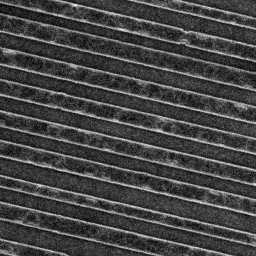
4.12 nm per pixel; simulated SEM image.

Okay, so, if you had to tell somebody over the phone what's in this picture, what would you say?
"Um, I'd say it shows parallel lines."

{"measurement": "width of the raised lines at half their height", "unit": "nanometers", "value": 64.8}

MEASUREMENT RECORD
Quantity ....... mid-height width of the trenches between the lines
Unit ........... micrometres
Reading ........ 0.0613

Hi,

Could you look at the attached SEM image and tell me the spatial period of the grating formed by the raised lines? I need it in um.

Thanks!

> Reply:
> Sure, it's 0.125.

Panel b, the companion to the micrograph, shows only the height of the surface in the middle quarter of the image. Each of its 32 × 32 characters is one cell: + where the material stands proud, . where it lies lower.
++++.................+++++++++++
++++++++..................++++++
++++++++++++..................++
+++++++++++++++++...............
...++++++++++++++++++...........
.......++++++++++++++++++.......
............++++++++++++++++++..
................++++++++++++++++
+++.................++++++++++++
++++++++................++++++++
+++++++++++++................+++
+++++++++++++++++...............
.....+++++++++++++++++..........
.........++++++++++++++++.......
.............+++++++++++++++++..
.................+++++++++++++++
+++++.................++++++++++
+++++++++.................++++++
+++++++++++++.................++
.+++++++++++++++++..............
.....+++++++++++++++++..........
..........++++++++++++++++......
..............+++++++++++++++++.
+++...............++++++++++++++
++++++++..............++++++++++
++++++++++++...............+++++
++++++++++++++++...............+
...++++++++++++++++++...........
........+++++++++++++++++.......
............+++++++++++++++++...
................++++++++++++++++
.....................+++++++++++